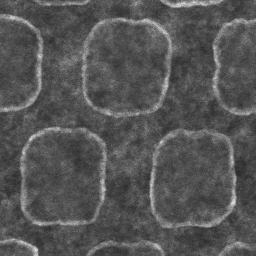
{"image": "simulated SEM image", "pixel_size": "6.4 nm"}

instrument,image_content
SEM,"raised bodies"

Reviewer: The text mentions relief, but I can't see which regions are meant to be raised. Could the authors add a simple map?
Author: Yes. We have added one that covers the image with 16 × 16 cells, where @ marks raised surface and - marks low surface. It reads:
----------------
@@----@@@@----@@
@@----@@@@@---@@
@@---@@@@@@--@@@
@@---@@@@@----@@
@@---@@@@@----@@
@@----@@@@----@@
----------------
--@@@@-----@@@--
--@@@@@---@@@@--
-@@@@@----@@@@@-
-@@@@@----@@@@@-
-@@@@@---@@@@@@-
--@@@@----@@@@--
----------------
@@----@@@@----@@